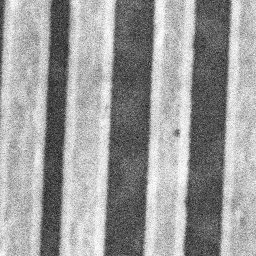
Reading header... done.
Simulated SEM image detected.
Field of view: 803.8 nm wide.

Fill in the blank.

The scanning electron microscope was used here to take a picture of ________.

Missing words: one or a few lines or trenches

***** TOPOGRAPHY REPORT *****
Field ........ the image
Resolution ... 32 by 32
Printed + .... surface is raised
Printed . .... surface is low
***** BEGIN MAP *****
.+++++...+++++......++++.....+++
.+++++...+++++......++++.....+++
.+++++...+++++......++++.....+++
.+++++...+++++......++++.....+++
.+++++...+++++......++++.....+++
.+++++...+++++......++++.....+++
.++++....+++++......++++.....+++
.++++....++++.......++++.....+++
.++++....++++.......+++......+++
.++++....++++.......+++......+++
.++++....++++.......+++......+++
.++++....++++......++++......+++
.++++....++++......++++......+++
.++++....++++......++++......+++
.++++....++++......++++......+++
+++++....++++......++++......+++
+++++....++++......++++......+++
+++++....++++......++++......+++
+++++....++++......++++......+++
+++++....++++......++++......+++
+++++....++++......++++......+++
+++++...+++++......++++......+++
+++++...+++++......++++.....++++
+++++...+++++......++++.....++++
+++++...+++++......++++.....++++
+++++...+++++......++++.....++++
+++++...+++++......++++.....++++
+++++...+++++......++++.....++++
+++++...+++++......+++......++++
+++++...++++.......+++......++++
++++....++++.......+++......++++
++++....++++.......+++......++++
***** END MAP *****